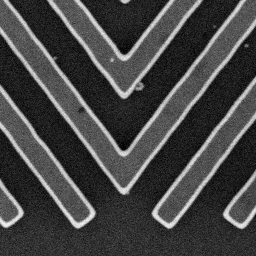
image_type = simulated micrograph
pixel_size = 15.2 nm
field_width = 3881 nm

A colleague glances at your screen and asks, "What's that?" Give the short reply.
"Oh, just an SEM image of groups of lines, slits or small figures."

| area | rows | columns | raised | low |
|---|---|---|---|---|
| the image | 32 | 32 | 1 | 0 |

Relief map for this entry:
10000011110000000000011110000011
11000001111000000000111100000111
11100000111100000000111000000111
11100000011100000001110000001110
01110000011110000011110000011110
01111000001111000111100000111100
00111100000111101111000000111000
00011100000011111110000001110000
00001110000011111110000011100000
00001111000001111100000111100000
00000111100000111000001111000000
00000011100000010000001110000001
10000001110000000000011100000011
11000001111000000000111100000111
11100000111100000001111000001111
11100000011100000001110000001110
01110000001110000011100000011100
01111000001111000111100000111100
00111100000111101111000001111000
00011100000011111110000001110000
00001110000001111100000011100000
00001111000001111100000111100000
00000111100000111000001111000001
00000011100000010000011110000001
10000001110000000000011100000011
11000001111000000000111100000111
11100000111100000001111000001111
11000000011000000000110000000110
00000000000000000000000000000000
00000000000000000000000000000000
00000000000000000000000000000000
00000000000000000000000000000000